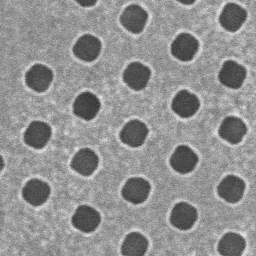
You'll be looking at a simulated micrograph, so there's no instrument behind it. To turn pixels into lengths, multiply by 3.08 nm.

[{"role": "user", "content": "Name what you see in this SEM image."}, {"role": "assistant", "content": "a regular array of holes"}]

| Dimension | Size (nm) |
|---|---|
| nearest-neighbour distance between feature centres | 169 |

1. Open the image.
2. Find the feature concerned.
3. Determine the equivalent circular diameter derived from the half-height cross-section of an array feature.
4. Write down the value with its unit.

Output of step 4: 91.8 nanometers